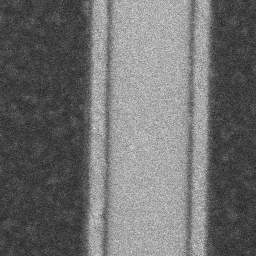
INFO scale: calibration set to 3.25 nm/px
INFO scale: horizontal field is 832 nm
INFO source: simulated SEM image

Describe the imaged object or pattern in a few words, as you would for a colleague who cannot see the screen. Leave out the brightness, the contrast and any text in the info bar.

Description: one or a few lines or trenches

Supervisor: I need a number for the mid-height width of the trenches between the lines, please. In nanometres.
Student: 328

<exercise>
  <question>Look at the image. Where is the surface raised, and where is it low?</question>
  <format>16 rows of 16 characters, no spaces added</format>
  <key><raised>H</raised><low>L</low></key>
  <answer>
HHHHHHLLLLLLLHHH
HHHHHHLLLLLLLHHH
HHHHHHLLLLLLLHHH
HHHHHHLLLLLLLHHH
HHHHHHLLLLLLLHHH
HHHHHHLLLLLLLHHH
HHHHHHLLLLLLLHHH
HHHHHHLLLLLLLHHH
HHHHHHLLLLLLHHHH
HHHHHHLLLLLLHHHH
HHHHHHLLLLLLHHHH
HHHHHHLLLLLLHHHH
HHHHHHLLLLLLHHHH
HHHHHHLLLLLLHHHH
HHHHHHLLLLLLHHHH
HHHHHHLLLLLLHHHH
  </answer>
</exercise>